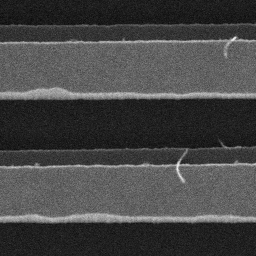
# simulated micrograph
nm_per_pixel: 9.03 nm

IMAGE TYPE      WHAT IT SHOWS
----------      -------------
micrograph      lines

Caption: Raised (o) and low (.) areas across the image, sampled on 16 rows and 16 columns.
................
................
.............ooo
oooooooooooooooo
oooooooooooooooo
oooooooooooooooo
................
................
................
................
oooooooooooooooo
oooooooooooooooo
oooooooooooooooo
oooooooooooooooo
................
................